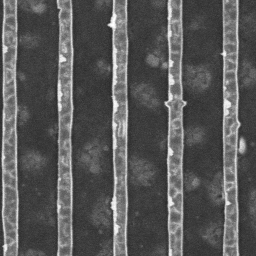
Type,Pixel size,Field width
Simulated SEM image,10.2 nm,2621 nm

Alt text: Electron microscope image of parallel lines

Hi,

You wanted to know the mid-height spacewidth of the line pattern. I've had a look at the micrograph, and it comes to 42.4 pixels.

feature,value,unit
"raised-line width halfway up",134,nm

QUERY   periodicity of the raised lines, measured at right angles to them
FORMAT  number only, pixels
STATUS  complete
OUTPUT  55.2